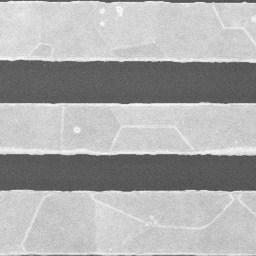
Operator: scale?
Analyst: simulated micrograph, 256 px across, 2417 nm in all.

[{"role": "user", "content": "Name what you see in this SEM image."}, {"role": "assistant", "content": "lines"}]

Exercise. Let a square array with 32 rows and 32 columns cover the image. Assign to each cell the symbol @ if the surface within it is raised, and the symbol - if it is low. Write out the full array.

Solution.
@@@@@@@@@@@@@@@@@@@@@@@@@@@@@@@@
@@@@@@@@@@@@@@@@@@@@@@@@@@@@@@@@
@@@@@@@@@@@@@@@@@@@@@@@@@@@@@@@@
@@@@@@@@@@@@@@@@@@@@@@@@@@@@@@@@
@@@@@@@@@@@@@@@@@@@@@@@@@@@@@@@@
@@@@@@@@@@@@@@@@@@@@@@@@@@@@@@@@
@@@@@@@@@@@@@@@@@@@@@@@@@@@@@@@@
------@----@--@@@@@-@@@@@@@@@@@@
--------------------------------
--------------------------------
--------------------------------
--------------------------------
--------------------------------
@@@@@@@@@@@@@@@@@@@@@@@@@@@@@@@@
@@@@@@@@@@@@@@@@@@@@@@@@@@@@@@@@
@@@@@@@@@@@@@@@@@@@@@@@@@@@@@@@@
@@@@@@@@@@@@@@@@@@@@@@@@@@@@@@@@
@@@@@@@@@@@@@@@@@@@@@@@@@@@@@@@@
@@@@@@@@@@@@@@@@@@@@@@@@@@@@@@@@
--------------------------------
--------------------------------
--------------------------------
--------------------------------
--------------------------------
@@@@@@@@@@@@@@@@@@@@@@@@@@@@@@@@
@@@@@@@@@@@@@@@@@@@@@@@@@@@@@@@@
@@@@@@@@@@@@@@@@@@@@@@@@@@@@@@@@
@@@@@@@@@@@@@@@@@@@@@@@@@@@@@@@@
@@@@@@@@@@@@@@@@@@@@@@@@@@@@@@@@
@@@@@@@@@@@@@@@@@@@@@@@@@@@@@@@@
@@@@@@@@@@@@@@@@@@@@@@@@@@@@@@@@
@@@@@@@@@@@@@@@@@@@@@@@@@@@@@@@@